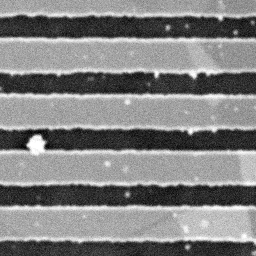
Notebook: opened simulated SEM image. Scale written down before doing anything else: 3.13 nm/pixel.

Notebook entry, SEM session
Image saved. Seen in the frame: lines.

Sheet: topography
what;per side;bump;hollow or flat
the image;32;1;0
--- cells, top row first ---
11111111111111111111111111111111
11111111111111111111111111111111
00000000000000000000000000000000
00000000000000000000000000000000
00000000000000000000000000000000
11111111111111111111111111111111
11111111111111111111111111111111
11111111111111111111111111111111
11111111111111111111111111111111
00000000000000000000000000000000
00000000000000000000000000000000
00000000000000000000000000000000
11111111111111111111111111111111
11111111111111111111111111111111
11111111111111111111111111111111
11111111111111111111111111111111
00000000000000000000000000000000
00001000000000000000000000000000
00001100000000000000000000000000
11111111111111111111111111111111
11111111111111111111111111111111
11111111111111111111111111111111
11111111111111111111111111111111
00000000000000000000000000000000
00000000000000000000000000000000
00000000000000000000000000000000
11111111111111111111111111111111
11111111111111111111111111111111
11111111111111111111111111111111
11111111111111111111111111111111
00000000000000000000000000000000
00000000000000000000000000000000